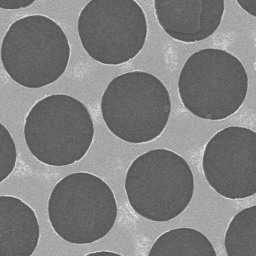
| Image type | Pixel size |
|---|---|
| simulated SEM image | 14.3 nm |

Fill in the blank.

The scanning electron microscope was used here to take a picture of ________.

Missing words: holes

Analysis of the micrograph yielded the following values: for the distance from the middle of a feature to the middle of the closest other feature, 1160 nm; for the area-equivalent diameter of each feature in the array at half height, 1010 nm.